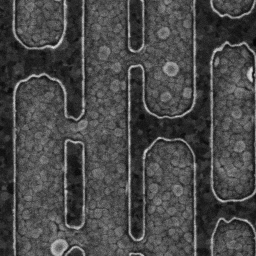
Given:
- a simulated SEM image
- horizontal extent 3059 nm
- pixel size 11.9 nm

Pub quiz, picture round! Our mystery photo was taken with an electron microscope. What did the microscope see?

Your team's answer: one or a few lines or trenches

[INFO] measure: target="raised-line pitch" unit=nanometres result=767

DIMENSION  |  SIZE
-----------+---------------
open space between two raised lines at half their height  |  0.539 microns